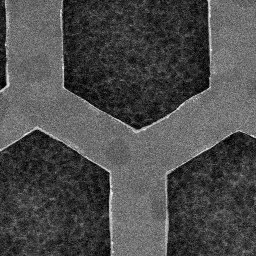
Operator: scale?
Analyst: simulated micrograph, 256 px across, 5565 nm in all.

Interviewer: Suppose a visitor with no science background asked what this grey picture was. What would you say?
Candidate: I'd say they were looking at holes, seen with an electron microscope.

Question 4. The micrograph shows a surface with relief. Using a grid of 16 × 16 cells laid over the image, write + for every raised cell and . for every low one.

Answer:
++++.........+++
++++.........+++
++++.........+++
++++.........+++
++++.........+++
++++.........+++
++++++.....+++++
+++++++...++++++
++.+++++++++++..
.....++++++++...
......+++++.....
.......+++......
.......+++......
.......+++......
.......+++......
.......+++......